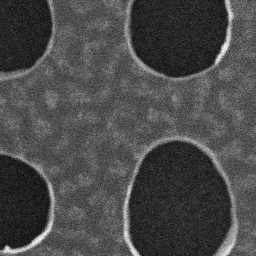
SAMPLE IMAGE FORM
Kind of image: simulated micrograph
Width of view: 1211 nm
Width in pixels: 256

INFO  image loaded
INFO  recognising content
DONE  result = holes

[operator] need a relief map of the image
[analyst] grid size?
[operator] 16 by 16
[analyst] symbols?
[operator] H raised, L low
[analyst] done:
LLLHHHHHLLLLLLHH
LLLHHHHHLLLLLLHH
LLLHHHHHLLLLLLHH
LLLHHHHHHLLLLLHH
LLHHHHHHHHLLLHHH
HHHHHHHHHHHHHHHH
HHHHHHHHHHHHHHHH
HHHHHHHHHHHHHHHH
HHHHHHHHHHHHHHHH
HHHHHHHHHLLLLHHH
LLHHHHHHHLLLLLHH
LLLHHHHHLLLLLLHH
LLLHHHHHLLLLLLHH
LLLHHHHHLLLLLLLH
LLLHHHHHLLLLLLHH
LHHHHHHHLLLLLLHH